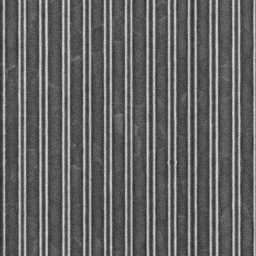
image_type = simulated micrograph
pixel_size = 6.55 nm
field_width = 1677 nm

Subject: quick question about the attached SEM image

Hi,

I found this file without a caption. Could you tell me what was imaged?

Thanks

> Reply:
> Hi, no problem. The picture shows parallel lines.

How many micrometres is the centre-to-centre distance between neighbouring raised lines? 0.14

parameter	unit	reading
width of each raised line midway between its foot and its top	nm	42.6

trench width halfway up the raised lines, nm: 96.6